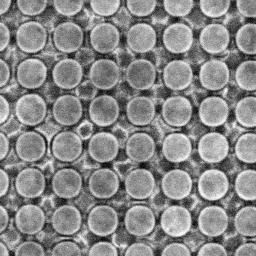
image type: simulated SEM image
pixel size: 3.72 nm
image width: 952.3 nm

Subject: a regular array of raised bodies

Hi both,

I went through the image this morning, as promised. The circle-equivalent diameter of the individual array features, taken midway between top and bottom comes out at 109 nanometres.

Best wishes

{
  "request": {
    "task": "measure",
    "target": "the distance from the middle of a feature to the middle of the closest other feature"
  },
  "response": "134 nm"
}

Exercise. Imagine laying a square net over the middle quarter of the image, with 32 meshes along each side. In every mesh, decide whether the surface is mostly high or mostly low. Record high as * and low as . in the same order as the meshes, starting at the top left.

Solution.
****...******...******....*****.
****...*******..*******..*******
****...*******..*******..*******
****...*******..*******..*******
****...******...******...*******
***.....****.....*****....*****.
................................
................................
***.....****......**.......***..
****...******...******...******.
****...******...******...*******
****...******...*******..*******
****...******...*******..*******
****...******...******...******.
***.....****.....****.....*****.
................................
................................
***...............**.......**...
****...******....*****....*****.
****...******...******...******.
****...******...*******..*******
****...******...*******..*******
****...******...******...******.
***....*****.....*****....*****.
................................
................................
**.......**.......***...........
****...******...******....*****.
****...******...******...******.
****..*******...******...*******
****..*******...******...*******
****...******...******...*******